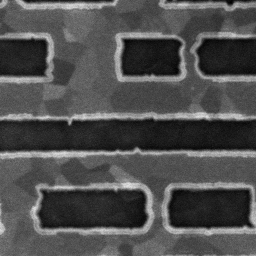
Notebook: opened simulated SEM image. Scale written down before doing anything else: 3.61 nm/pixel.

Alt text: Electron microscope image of one or a few lines or trenches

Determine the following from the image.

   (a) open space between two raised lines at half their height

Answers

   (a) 0.146 micrometres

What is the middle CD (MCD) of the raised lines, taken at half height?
0.127 microns